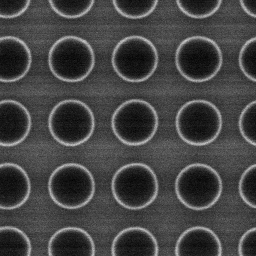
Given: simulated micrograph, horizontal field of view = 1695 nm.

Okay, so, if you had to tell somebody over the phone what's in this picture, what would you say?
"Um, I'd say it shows an array of small figures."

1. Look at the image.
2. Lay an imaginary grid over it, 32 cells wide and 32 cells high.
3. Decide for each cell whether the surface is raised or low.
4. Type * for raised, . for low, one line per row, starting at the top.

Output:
****..*****...*****...*****...**
***....****....****....****....*
................................
................................
................................
***....****....****....****....*
****..******..******..******..**
****..******..******..******..**
****..*****...*****...*****...**
***....****....****....****....*
................................
................................
........*.......**..............
***....****....****....****....*
****..******..******..******..**
****..******..******..******..**
***...*****...*****...*****...**
***....****....****....****....*
................................
................................
**......**......**......*.......
***....****....****....****....*
****..******..******..******..**
****..******..******..******..**
***...*****...*****...*****...**
***....****....****....****....*
................................
................................
**......**......**......**......
***....****....****....****...**
****..******..******..******..**
****..******..******..******..**